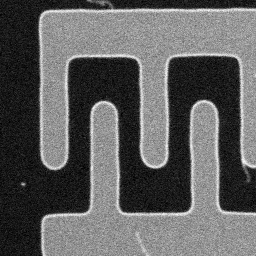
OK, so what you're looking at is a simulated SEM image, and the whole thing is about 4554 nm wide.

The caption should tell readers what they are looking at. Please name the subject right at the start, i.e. groups of lines, slits or small figures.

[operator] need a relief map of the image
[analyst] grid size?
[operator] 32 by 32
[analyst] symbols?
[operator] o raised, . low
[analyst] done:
................................
......oooooooooooooooooooooooooo
.....ooooooooooooooooooooooooooo
.....ooooooooooooooooooooooooooo
.....ooooooooooooooooooooooooooo
.....ooooooooooooooooooooooooooo
.....ooooooooooooooooooooooooooo
.....oooo........oooo.........oo
.....ooo..........ooo.........oo
.....ooo..........ooo.........oo
.....ooo..........ooo.........oo
.....ooo..........ooo.........oo
.....ooo..........ooo.........oo
.....ooo....oo....ooo...ooo...oo
.....ooo...oooo...ooo...ooo...oo
.....ooo...oooo...ooo...ooo...oo
.....ooo...oooo...ooo...ooo...oo
.....ooo...oooo...ooo...ooo...oo
.....ooo...oooo...ooo...ooo...oo
.....ooo...oooo...ooo...ooo...oo
......oo...oooo...oo....ooo....o
...........oooo.........ooo.....
...........oooo.........ooo.....
...........oooo.........ooo.....
...........oooo.........ooo.....
...........oooo.........ooo.....
...........oooo........ooooo....
.....ooooooooooooooooooooooooooo
.....ooooooooooooooooooooooooooo
.....ooooooooooooooooooooooooooo
.....ooooooooooooooooooooooooooo
.....ooooooooooooooooooooooooooo